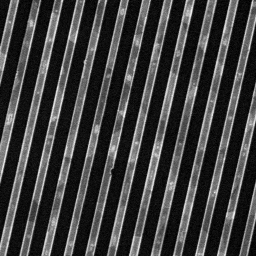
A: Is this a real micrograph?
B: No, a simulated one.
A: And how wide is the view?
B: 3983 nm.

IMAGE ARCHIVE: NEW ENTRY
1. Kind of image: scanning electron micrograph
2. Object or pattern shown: parallel lines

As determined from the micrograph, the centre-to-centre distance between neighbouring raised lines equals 0.334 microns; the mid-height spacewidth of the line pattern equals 0.222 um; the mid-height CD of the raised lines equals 104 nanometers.